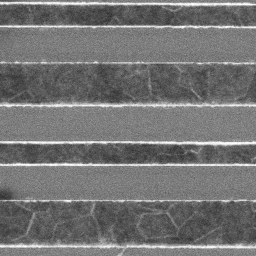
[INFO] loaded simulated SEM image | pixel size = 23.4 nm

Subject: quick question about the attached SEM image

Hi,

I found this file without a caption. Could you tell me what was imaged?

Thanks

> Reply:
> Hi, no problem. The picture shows lines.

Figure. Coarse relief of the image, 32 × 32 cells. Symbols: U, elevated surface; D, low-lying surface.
UUUUUUUUUUUUUUUUUUUUUDDDDDDDDDDD
UUUUUUUUUUUUUUUUUUUUUUUUUUUUUUUU
UUUUUUUUUUUUUUUUUUUUUUUUUUUUUUUU
DDDDDDDDDDDDDDDDDDDDDDDDDDDDDDDD
DDDDDDDDDDDDDDDDDDDDDDDDDDDDDDDD
DDDDDDDDDDDDDDDDDDDDDDDDDDDDDDDD
DDDDDDDDDDDDDDDDDDDDDDDDDDDDDDDD
DDDDDDDDDDDDDDDDDDDDDDDDDDDDDDDD
UUUUUUUUUUUUUUUUUUUUUUUUUUUUUUUU
UUUUUUUUUUUUUUUUUUUUUUUUUUUUUUUU
UUUUUUUUUUUUUUUUUUUUUUUUUUUUUUUU
UUUUUUUUUUUUUUUUUUUUUUUUUUUUUUUU
UUUUUUUUUUUUUUUUUUUUUUUUUUUUUUUU
DDDDDDDDDDDDDDDDDDDDDDDDDDDDDDDD
DDDDDDDDDDDDDDDDDDDDDDDDDDDDDDDD
DDDDDDDDDDDDDDDDDDDDDDDDDDDDDDDD
DDDDDDDDDDDDDDDDDDDDDDDDDDDDDDDD
DDDDDDDDDDDDDDDDDDDDDDDDDDDDDDDD
UUUUUUUUUUUUUUUUUUUUUUUUUUUUUUUU
UUUUUUUUUUUUUUUUUUUUUUUUUUUUUUUU
UUUUUUUUUUUUUUUUUUUUUUUUUUUUUUUU
DDDDDDDDDDDDDDDDDDDDDDDDDDDDDDDD
DDDDDDDDDDDDDDDDDDDDDDDDDDDDDDDD
DDDDDDDDDDDDDDDDDDDDDDDDDDDDDDDD
DDDDDDDDDDDDDDDDDDDDDDDDDDDDDDDD
UUUUUUUUUUUUUUUUUUUUUUUUUUUUUUUU
UUUUUUUUUUUUUUUUUUUUUUUUUUUUUUUU
UUUUUUUUUUUUUUUUUUUUUUUUUUUUUUUU
UUUUUUUUUUUUUUUUUUUUUUUUUUUUUUUU
UUUUUUUUUUUUUUUUUUUUUUUUUUUUUUUU
UUUUUUUUUUUUUUUUUUUUUUUUUUUUUUUU
DDDDDDDDDDDDDDDDDDDDDDDDDDDDDDDD